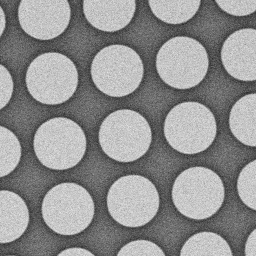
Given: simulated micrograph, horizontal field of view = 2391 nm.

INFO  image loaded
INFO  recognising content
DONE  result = an array of small figures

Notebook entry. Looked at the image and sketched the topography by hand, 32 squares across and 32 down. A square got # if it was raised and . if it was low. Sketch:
...######.#######..######..#####
..#######..######..#####....####
#.#######..#####....###.........
...#####....###.................
....###......................###
.....................####...####
............#####...######..####
....#####...######..######..####
#...#####..#######..######..####
#..#######..######..######...###
##.#######..#####....####.......
#...#####....###................
#....###......................##
......................####...###
..............####...######..###
.....#####...#####...######..###
#....#####..#######..######..###
##..#######.#######..######...##
###.#######..#####....####......
###..#####....####..............
##...####......................#
#......................####...##
...............###....######..##
.......###....#####...######..##
##....#####..#######..######..##
###..#######.#######..######...#
###..#######..######...####.....
####..#####...#####.............
###...#####.....................
##......................###....#
................###....#####...#
........###....#####...######..#